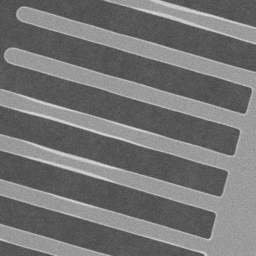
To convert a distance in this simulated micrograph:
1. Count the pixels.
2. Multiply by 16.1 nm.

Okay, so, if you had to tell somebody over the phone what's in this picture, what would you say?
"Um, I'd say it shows groups of lines, slits or small figures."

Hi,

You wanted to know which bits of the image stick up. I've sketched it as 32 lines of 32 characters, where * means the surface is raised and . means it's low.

...............******...........
..****.............******.......
...******.............******....
.....*******.............*******
.........*******.............***
.............******.............
.**.............*******.........
.******.............******......
...*******.............*******..
.......*******.............*****
..........********............**
*.............*******..........*
****.............*******.......*
.*******.............*******...*
.....*******............********
.........******.............****
............*******...........**
***............*******........**
******.............******.....**
...******.............**********
......******.............*******
..........******............****
.............*******........****
****............*******.....****
*******.............************
....******.............*********
.......*******.............*****
...........*******.........*****
**............*******......*****
*****.............******..******
..*******.............**********
.....*******.............*******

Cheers